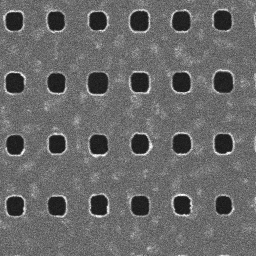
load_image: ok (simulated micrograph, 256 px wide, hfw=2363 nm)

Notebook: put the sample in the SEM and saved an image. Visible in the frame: a regular array of holes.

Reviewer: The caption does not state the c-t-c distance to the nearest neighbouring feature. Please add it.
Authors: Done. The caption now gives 384 nm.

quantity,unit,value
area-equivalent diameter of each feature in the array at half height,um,0.183